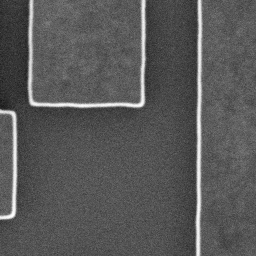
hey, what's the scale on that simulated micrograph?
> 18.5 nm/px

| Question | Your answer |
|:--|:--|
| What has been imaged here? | groups of lines, slits or small figures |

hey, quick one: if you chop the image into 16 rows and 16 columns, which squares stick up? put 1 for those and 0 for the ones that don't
0011111110001111
0011111110001111
0011111110001111
0011111110001111
0011111110001111
0011111110001111
0011111110001111
1000000000001111
1000000000001111
1000000000001111
1000000000001111
1000000000001111
1000000000001111
1000000000001111
0000000000001111
0000000000001111